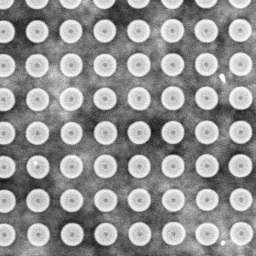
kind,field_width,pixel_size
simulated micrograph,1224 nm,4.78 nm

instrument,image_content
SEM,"an array of small figures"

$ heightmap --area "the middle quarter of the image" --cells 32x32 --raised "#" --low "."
####....#####...#####...######..
####....#####...#####....#####..
####....####.....###......###...
................................
................................
................................
####.....###.....###.....####...
####....#####...#####....#####..
#####...#####...#####...######..
#####...#####...#####...######..
####....####.....####....####...
.##.............................
................................
................................
.........##.......#.......##....
####....#####....####....#####..
####....#####...######...#####..
####....#####...######...#####..
####....#####...#####....#####..
####.....###.....###......###...
................................
................................
................................
####....####.....####....####...
####....#####...#####....#####..
#####...#####...#####....#####..
####....#####...#####....#####..
####....#####....####....####...
................................
................................
................................
.##.......#.......##......##....